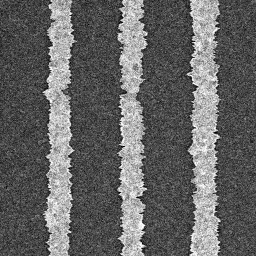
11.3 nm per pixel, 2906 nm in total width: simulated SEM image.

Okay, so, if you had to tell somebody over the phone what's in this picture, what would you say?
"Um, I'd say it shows one or a few lines or trenches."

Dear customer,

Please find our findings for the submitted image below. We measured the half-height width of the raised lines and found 235 nanometres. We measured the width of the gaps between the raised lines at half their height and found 584 nm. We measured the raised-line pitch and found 821 nanometres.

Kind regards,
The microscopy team